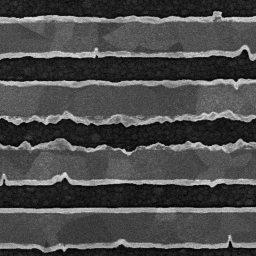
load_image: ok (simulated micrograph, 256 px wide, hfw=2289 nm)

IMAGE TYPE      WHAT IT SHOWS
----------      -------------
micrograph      one or a few lines or trenches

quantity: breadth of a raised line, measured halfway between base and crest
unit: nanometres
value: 325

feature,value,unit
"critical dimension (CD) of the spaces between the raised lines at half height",0.248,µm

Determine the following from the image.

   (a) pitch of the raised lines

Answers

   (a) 570 nanometres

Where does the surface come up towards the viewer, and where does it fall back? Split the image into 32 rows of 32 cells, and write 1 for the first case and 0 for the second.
00000000000000000000000000000000
00000000000000000000000000000000
11111111111111111111111111111111
11111111111111111111111111111111
11111111111111111111111111111111
11111111111111111111111111111111
11111111111111111111111111111101
00000000000000000000000000000000
00000000000000000000000000000000
00000000000000000000000000000000
11111111101111111111111111111111
11111111111111111111111111111111
11111111111111111111111111111111
11111111111111111111111111111111
11111111111111111111111111100111
00000000000010000000000000000000
00000000000000000000000000000000
00000000000000000000000000000000
11111111111011000111111111111111
11111111111111111111111111111111
11111111111111111111111111111111
11111111111111111111111111111111
11111110011111111111111111111111
00000000000000000000000000000000
00000000000000000000000000000000
00000000000000000000000000000000
11111111111111111111111111111111
11111111111111111111111111111111
11111111111111111111111111111111
11111111111111111111111111111111
11111111111111101111111111110111
00000000000000000000000000000000